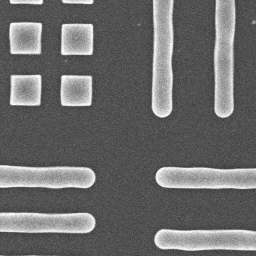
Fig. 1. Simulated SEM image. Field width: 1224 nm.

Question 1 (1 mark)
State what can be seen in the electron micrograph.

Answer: groups of lines, slits or small figures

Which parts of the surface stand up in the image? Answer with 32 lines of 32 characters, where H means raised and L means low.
LLLLLLLLLLLLLLLLLLLHHHLLLLLHHLLL
LLLLLLLLLLLLLLLLLLLHHLLLLLLHHLLL
LLLLLLLLLLLLLLLLLLLHHLLLLLLHHLLL
LHHHHLLLHHHHLLLLLLLHHHLLLLLHHLLL
LHHHHLLLHHHHLLLLLLLHHHLLLLLHHLLL
LHHHHLLLHHHHLLLLLLLHHHLLLLLHHLLL
LLHHHLLLHHHLLLLLLLLHHHLLLLLHHLLL
LLLLLLLLLLLLLLLLLLLHHLLLLLLHHLLL
LLLLLLLLLLLLLLLLLLLHHLLLLLLHHLLL
LLHHHLLLHHLLLLLLLLLHHHLLLLLHHLLL
LHHHHLLLHHHLLLLLLLLHHHLLLLLHHLLL
LHHHHLLLHHHLLLLLLLLHHLLLLLLHHLLL
LHHHHLLLHHHLLLLLLLLHHLLLLLLHHLLL
LLLLLLLLLLLLLLLLLLLHHLLLLLLHHLLL
LLLLLLLLLLLLLLLLLLLLHLLLLLLHHLLL
LLLLLLLLLLLLLLLLLLLLLLLLLLLLLLLL
LLLLLLLLLLLLLLLLLLLLLLLLLLLLLLLL
LLLLLLLLLLLLLLLLLLLLLLLLLLLLLLLL
LLLLLLLLLLLLLLLLLLLLLLLLLLLLLLLL
LLLLLLLLLLLLLLLLLLLLLLLLLLLLLLLL
LLLLLLLLLLLLLLLLLLLLLLLLLLLLLLLL
HHHHHHHHHHHHLLLLLLLLHHHHHHHHHHHH
HHHHHHHHHHHHLLLLLLLLHHHHHHHHHHHH
LLLLLLLLLLLLLLLLLLLLLLLLLLLLLLHL
LLLLLLLLLLLLLLLLLLLLLLLLLLLLLLLL
LLLLLLLLLLLLLLLLLLLLLLLLLLLLLLLL
LLLLLLLLLLLLLLLLLLLLLLLLLLLLLLLL
HHHHHHHHHHHHLLLLLLLLLLLLLLLLLLLL
HHHHHHHHHHHHLLLLLLLLLLLLLLLLLLLL
LLLLLLLLLLLLLLLLLLLHHHHHHHHHHHHH
LLLLLLLLLLLLLLLLLLLLHHHHHHHHHHHH
LLLLLLLLLLLLLLLLLLLLLLLLLLLLLLLL